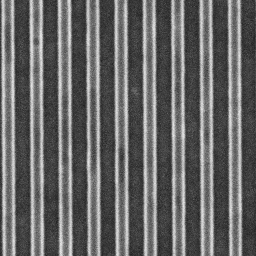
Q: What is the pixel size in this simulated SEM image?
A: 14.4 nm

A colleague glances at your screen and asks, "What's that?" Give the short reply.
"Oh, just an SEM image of parallel lines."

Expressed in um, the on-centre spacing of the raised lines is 0.409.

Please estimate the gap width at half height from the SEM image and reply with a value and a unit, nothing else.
258 nanometers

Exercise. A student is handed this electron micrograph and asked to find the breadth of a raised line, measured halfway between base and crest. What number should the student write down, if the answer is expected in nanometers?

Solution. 148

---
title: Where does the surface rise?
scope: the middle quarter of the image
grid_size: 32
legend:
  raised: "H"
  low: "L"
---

HLLLLLHHHLLLLHHHLLLLHHHLLLLHHHLL
HLLLLLHHHLLLLHHHLLLLHHHLLLLHHHLL
HLLLLLHHHLLLLHHHLLLLHHHLLLLHHHLL
HLLLLLHHHLLLLHHHLLLLHHHLLLLHHHLL
HLLLLLHHHLLLLHHHLLLLHHHLLLLHHHLL
HLLLLLHHHLLLLHHHLLLLHHHLLLLHHHLL
HLLLLLHHHLLLLHHHLLLLHHHLLLLHHHLL
HLLLLLHHHLLLLHHHLLLLHHHLLLLHHHLL
HHLLLLHHHLLLLHHHLLLLHHHLLLLHHHLL
HHLLLLHHHLLLLHHHLLLLHHHLLLLHHHLL
HLLLLLHHHLLLLHHHLLLLHHHLLLLHHHLL
HHLLLLHHHLLLLHHLLLLLHHHLLLLHHHLL
HLLLLLHHHLLLLHHHLLLLHHHLLLLHHHLL
HLLLLLHHHLLLLHHHLLLLHHHLLLLHHHLL
HLLLLLHHHLLLLHHHLLLLHHHLLLLHHHLL
HLLLLLHHHLLLLHHHLLLLHHHLLLLHHHLL
HLLLLLHHHLLLLHHHLLLLHHHLLLLHHHLL
HHLLLLHHHLLLLHHHLLLLHHHLLLLHHHLL
HHLLLLHHHLLLLHHHLLLLHHHLLLLHHHLL
HHLLLLHHHLLLLHHHLLLLHHHLLLLHHHLL
HHLLLLHHHLLLLHHHLLLLHHHLLLLHHHLL
HHLLLLHHHLLLLHHHLLLLHHHLLLLHHHLL
HHLLLLHHHLLLLHHHLLLLHHHLLLLHHHLL
HHLLLLHHHLLLLHHHLLLLHHHLLLLHHHLL
HHLLLLHHHLLLLHHHLLLLHHHLLLLHHHLL
HHLLLLHHHLLLLHHHLLLLHHHLLLLHHHLL
HHLLLLHHHLLLLHHHLLLLHHHLLLLHHHLL
HHLLLLHHHLLLLHHHLLLLHHHLLLLHHHLL
HHLLLLHHHLLLLHHHLLLLHHHLLLLHHHLL
HHLLLLHHHLLLLHHHLLLLHHHLLLLHHHLL
HHLLLLHHHLLLLHHHLLLLHHHLLLLHHHLL
HHLLLLHHHLLLLHHHLLLLHHHLLLLHHHLL